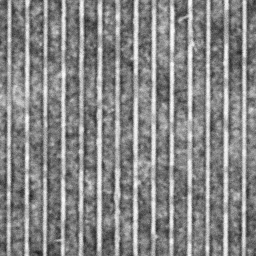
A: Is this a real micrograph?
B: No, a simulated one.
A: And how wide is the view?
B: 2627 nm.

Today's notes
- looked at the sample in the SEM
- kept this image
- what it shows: parallel lines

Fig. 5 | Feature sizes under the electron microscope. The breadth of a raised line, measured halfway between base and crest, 0.0257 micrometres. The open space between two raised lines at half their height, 156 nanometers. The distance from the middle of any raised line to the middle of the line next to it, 186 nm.